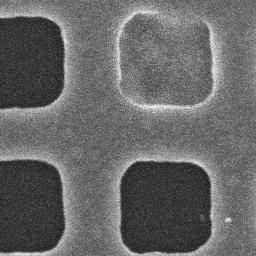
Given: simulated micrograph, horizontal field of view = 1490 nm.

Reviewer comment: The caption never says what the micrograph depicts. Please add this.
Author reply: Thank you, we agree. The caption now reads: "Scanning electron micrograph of holes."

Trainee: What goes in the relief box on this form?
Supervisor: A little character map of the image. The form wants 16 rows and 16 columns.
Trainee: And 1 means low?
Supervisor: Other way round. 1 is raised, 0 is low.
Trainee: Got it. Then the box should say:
1111111111111111
0001111111111111
0000111111111111
0000111111111111
0000111111111111
0000111111111111
0001111111111111
1111111111111111
1111111111111111
1111111111111111
0001111100000111
0000111000000111
0000111100000111
0000111100000111
0000111100000111
0001111100001111